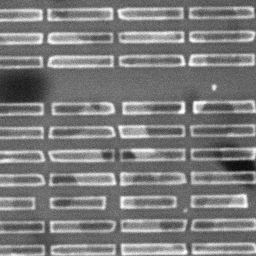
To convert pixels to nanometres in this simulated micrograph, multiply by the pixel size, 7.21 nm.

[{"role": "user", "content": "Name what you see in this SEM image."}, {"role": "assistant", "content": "wiring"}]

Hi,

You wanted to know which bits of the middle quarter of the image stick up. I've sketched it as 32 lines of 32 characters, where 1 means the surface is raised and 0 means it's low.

11111111111100011111111111110000
00000000000000000000000000000000
00000000000000000000000000000000
00000000000000000000000000000000
00000000000000000000000000000000
00000000000000000000000000000000
00000000000000000000000000000000
00000000000000000000000000000000
00000000000000000000000000000000
00000000000000000000000000000000
11111111111100011111111111111100
11111111111100011111111111111100
00000000000000000000000000000000
00000000000000000000000000000000
00000000000000000000000000000000
00000000000000000000000000000000
11111111111100111111111111111100
11111111111110111111111111111100
00000000000000000000000000000000
00000000000000000000000000000000
00000000000000000000000000000000
00000000000000000000111111111100
11111111111100111111111111111100
11111111111100111111111111111100
00000000000000000000000000000000
00000000000000000000000000000000
00000000000000000000000000000000
00000000000000111111111111111100
11111111111110111111111111111100
11111111111110111111111111111100
00000000000000000000000000000000
00000000000000000000000000000000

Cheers